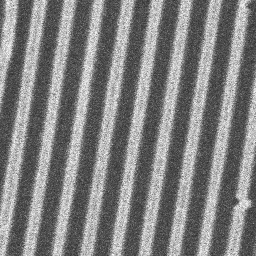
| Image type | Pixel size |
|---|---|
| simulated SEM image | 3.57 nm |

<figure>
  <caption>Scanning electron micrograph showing parallel lines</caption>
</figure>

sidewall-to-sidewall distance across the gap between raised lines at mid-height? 16.3 px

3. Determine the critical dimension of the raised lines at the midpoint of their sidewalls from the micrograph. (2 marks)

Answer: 42.6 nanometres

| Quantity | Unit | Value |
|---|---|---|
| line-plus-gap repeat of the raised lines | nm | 102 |